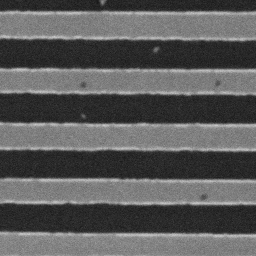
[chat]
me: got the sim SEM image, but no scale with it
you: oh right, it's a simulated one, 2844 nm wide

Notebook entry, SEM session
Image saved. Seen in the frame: lines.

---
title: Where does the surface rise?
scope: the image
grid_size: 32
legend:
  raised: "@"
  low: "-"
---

--------------------------------
-@@@--------@@------------------
@@@@@@@@@@@@@@@@@@@@@@@@@@@@@@@@
@@@@@@@@@@@@@@@@@@@@@@@@@@@@@@@@
@@@@@@@@@@@@@@@@@@@@@@@@@@@@@@@@
--------------------------------
--------------------------------
--------------------------------
--------------------------------
@@@@@@@@@@@@@@@@@@@@@@@@@@@@@@@@
@@@@@@@@@@@@@@@@@@@@@@@@@@@@@@@@
@@@-@@@@@@@@@@@@@@@@@@@@@@@@@@@@
--------------------------------
--------------------------------
--------------------------------
@@@@@@@@@@@---@--@@-----@-------
@@@@@@@@@@@@@@@@@@@@@@@@@@@@@@@@
@@@@@@@@@@@@@@@@@@@@@@@@@@@@@@@@
@@@@@@@@@@@@@@@@@@@@@@@@@@@@@@@@
--------------------------------
--------------------------------
--------------------------------
@@@@@@@@@@@@@@@@@@@-------------
@@@@@@@@@@@@@@@@@@@@@@@@@@@@@@@@
@@@@@@@@@@@@@@@@@@@@@@@@@@@@@@@@
--------------------------------
--------------------------------
--------------------------------
--------------------------------
@@@@@@@@@@@@@@@@@@@@@@@@@@@@@@@@
@@@@@@@@@@@@@@@@@@@@@@@@@@@@@@@@
@@@@@@@@@@@@@@@@@@@@@@@@@@@@@@@@